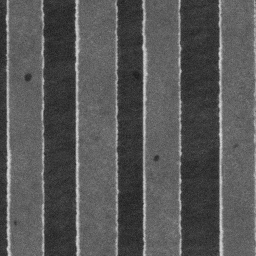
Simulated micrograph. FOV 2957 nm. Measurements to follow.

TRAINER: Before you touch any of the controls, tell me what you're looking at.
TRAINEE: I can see lines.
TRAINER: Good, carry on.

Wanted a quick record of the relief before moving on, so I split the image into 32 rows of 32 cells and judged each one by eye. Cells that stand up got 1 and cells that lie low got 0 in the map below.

01111000001111100011110000011111
01111000001111100011110000001111
01111000001111100011110000011111
01111000001111100011110000001111
01111000001111100011110000001111
01111000001111100011110000001111
01111000001111100011111000001111
01111000001111100011110000011111
01111000011111100011111000011111
01111000001111100011111000001111
01111000001111100011110000001111
01111000001111100011110000001111
01111000001111100011111000001111
01111000001111100011111000001111
01111000001111100011111000001111
01111000001111100011111000001111
01111000001111100011111000001111
01111000001111100011111000001111
01111000001111100011111000001111
01111000001111100011111000001111
01111000001111100011111000001111
01111000001111100011111000001111
01111000001111100011111000001111
01111000001111100011111000001111
01111000001111100011110000001111
01111000001111100011111000001111
01111000001111100011111000001111
01111000001111100011111000001111
01111000001111100011111000001111
01111000001111100011111000001111
01111000001111100011111000001111
01111000001111100011111000001111